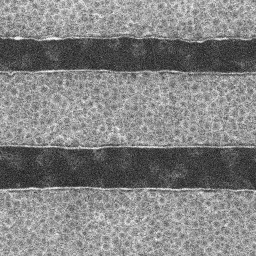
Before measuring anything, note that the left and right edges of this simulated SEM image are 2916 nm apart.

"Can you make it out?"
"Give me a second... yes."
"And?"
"one or a few lines or trenches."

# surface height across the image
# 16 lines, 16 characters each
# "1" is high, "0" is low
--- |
0000000000000000
0000000000000000
1111111111110111
1111111111111111
1110000110011111
0000000000000000
0000000000000000
0000000000000000
0000000000000000
1111111111111111
1111111111111111
1111111111111111
0000000000000000
0000000000000000
0000000000000000
0000000000000000